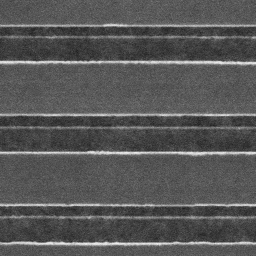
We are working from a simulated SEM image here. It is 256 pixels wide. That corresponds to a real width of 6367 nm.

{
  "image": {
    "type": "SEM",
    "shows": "lines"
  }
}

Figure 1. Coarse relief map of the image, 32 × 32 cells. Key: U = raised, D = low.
UUUUUUUUUUUUUUUUUUUUUUUUUUUUUUUU
UUUUUUUUUUUUUUUUUUUUUUUUUUUUUUUU
UUUUUUUUUUUUUUUUUUUUUUUUUUUUUUUU
DDDDDDDDDDDDDDDDDDDDDDDDDDDDDDDD
DDDDDDDDDDDDDDDDDDDDDDDDDDDDDDDD
DDDDDDDDDDDDDDDDDDDDDDDDDDDDDDDD
DDDDDDDDDDDDDDDDDDDDDDDDDDDDDDDD
DDDDDDDDDDDDDDDDDDDDDDDDDDDDDDDD
UUUUUUUUUUUUUUUUUUUUUUUUUUUUUUUU
UUUUUUUUUUUUUUUUUUUUUUUUUUUUUUUU
UUUUUUUUUUUUUUUUUUUUUUUUUUUUUUUU
UUUUUUUUUUUUUUUUUUUUUUUUUUUUUUUU
UUUUUUUUUUUUUUUUUUUUUUUUUUUUUUUU
UUUUUUUUUUUUUUUUUUUUUUUUUUUUUUUU
DDDDDDDDDDDDDDDDDDDDDDDDDDDDDDDD
DDDDDDDDDDDDDDDDDDDDDDDDDDDDDDDD
DDDDDDDDDDDDDDDDDDDDDDDDDDDDDDDD
DDDDDDDDDDDDDDDDDDDDDDDDDDDDDDDD
DDDDDDDDDDDDDDDDDDDDDDDDDDDDDDDD
UUUUUUUUUUUUUUUUUUUUUUUUUUUUUUUU
UUUUUUUUUUUUUUUUUUUUUUUUUUUUUUUU
UUUUUUUUUUUUUUUUUUUUUUUUUUUUUUUU
UUUUUUUUUUUUUUUUUUUUUUUUUUUUUUUU
UUUUUUUUUUUUUUUUUUUUUUUUUUUUUUUU
UUUUUUUUUUUUUUUUUUUUUUUUUUUUUUUU
UUUUUUUUUUUUUUUUUUUUUUUUUUUUUUUU
DDDDDDDDDDDDDDDDDDDDDDDDDDDDDDDD
DDDDDDDDDDDDDDDDDDDDDDDDDDDDDDDD
DDDDDDDDDDDDDDDDDDDDDDDDDDDDDDDD
DDDDDDDDDDDDDDDDDDDDDDDDDDDDDDDD
UUUUUUUUUUUUUUUUUUUUUUUUUUUUUUUU
UUUUUUUUUUUUUUUUUUUUUUUUUUUUUUUU